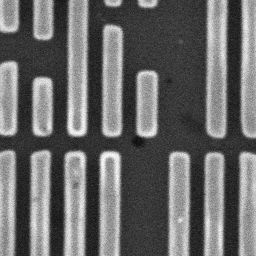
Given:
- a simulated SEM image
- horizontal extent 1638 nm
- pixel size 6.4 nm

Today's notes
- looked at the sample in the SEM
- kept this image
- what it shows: wiring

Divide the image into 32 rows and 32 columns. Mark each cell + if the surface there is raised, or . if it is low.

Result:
++..+++..++..++...+.......++..++
++..+++..++...............++..++
++..+++..++...............++..++
++..+++..++..++...........++..++
....++...++..++...........++..++
.........++..++...........++..++
.........++..++...........++..++
.........++..++...........++..++
++.......++..++...........++..++
++.......++..++..+++......++..++
++..++...++..++..+++......++..++
++..++...++..++..+++......++..++
++..++...++..++..+++......++..++
++..++...++..++..+++......++..++
++..++...++..++..+++......++..++
++..++..+++..++..+++......++..++
++..++...++..++..++.......++..++
................................
................................
++..++..+++..++......++...++..++
++..++..+++..++......+++..++..++
++..++..+++..++......+++..++..++
++..++..+++..++......+++..++..++
++..++..+++..++......+++..++..++
++..++..+++..++......+++..++..++
++..++..+++..++......+++..++..++
++..++..+++..++......+++..++..++
++..++..+++..++......+++..++..++
++..++..+++..++......+++..++..++
++..++..+++..++......+++..++..++
++..++..+++..++......+++..++..++
++..++..+++..++......+++..++..++